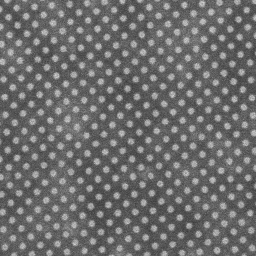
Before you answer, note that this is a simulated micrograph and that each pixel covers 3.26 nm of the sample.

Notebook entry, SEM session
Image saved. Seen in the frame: a regular array of raised bodies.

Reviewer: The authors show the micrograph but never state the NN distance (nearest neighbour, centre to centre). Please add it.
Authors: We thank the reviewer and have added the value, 0.0399 microns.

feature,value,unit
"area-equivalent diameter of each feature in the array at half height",19.1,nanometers